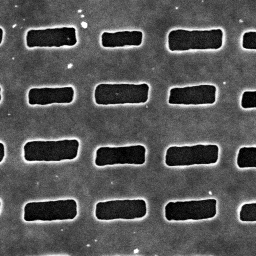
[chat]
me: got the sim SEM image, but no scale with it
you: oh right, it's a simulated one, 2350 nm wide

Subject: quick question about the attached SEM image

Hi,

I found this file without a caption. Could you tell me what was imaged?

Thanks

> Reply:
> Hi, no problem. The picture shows a regular array of holes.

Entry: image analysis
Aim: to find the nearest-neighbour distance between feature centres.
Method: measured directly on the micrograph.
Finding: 502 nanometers